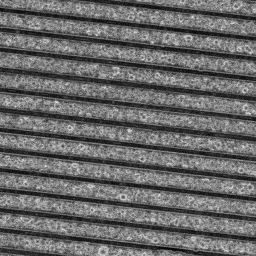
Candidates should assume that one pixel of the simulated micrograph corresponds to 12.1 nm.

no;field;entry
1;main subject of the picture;parallel lines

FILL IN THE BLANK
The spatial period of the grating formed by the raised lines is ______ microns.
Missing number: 0.24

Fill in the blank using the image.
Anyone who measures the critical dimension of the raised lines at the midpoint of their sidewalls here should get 181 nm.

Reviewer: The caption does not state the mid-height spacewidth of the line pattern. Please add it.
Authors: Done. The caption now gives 59.8 nanometers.